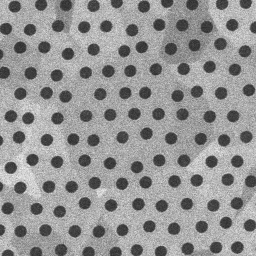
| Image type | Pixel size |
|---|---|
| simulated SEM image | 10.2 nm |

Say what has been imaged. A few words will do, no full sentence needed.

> a regular array of holes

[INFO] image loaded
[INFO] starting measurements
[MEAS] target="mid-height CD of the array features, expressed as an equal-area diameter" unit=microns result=0.127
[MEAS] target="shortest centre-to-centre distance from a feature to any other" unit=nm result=229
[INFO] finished